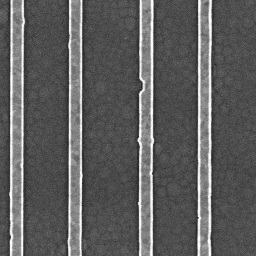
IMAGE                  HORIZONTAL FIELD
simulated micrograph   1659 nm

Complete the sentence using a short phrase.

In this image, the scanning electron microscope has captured one or a few lines or trenches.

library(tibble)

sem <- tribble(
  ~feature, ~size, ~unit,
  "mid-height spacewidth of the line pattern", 305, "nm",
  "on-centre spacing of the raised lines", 0.405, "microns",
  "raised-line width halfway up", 0.0753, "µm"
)